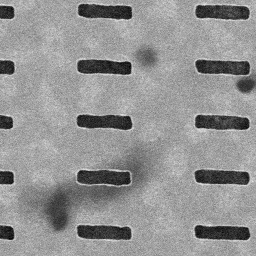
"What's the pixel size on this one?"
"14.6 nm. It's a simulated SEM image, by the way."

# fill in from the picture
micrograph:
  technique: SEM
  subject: a regular array of holes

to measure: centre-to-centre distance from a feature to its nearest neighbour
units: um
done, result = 0.805